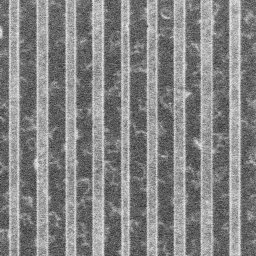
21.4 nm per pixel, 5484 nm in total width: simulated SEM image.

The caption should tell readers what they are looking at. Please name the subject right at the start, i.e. parallel lines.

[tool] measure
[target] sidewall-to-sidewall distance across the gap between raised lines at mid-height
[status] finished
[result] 185 nanometres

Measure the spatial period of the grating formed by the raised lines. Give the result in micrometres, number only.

0.588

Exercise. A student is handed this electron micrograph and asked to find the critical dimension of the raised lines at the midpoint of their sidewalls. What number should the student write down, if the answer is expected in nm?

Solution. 407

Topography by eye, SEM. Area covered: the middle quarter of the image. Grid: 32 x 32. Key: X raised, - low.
---XXXX---XXXX--XXXXX--XXXXX--XX
---XXXX---XXXX--XXXXX--XXXXX--XX
---XXXX---XXXX--XXXXX--XXXXX--XX
---XXXX---XXXX--XXXXX--XXXXX--XX
---XXXX---XXXX--XXXXX--XXXXX--XX
---XXXX---XXXX--XXXXX--XXXXX--XX
---XXXX---XXXX--XXXXX--XXXXX--XX
---XXXX---XXXX--XXXXX--XXXXX--X-
---XXXX---XXXX--XXXXX--XXXXX--XX
---XXXX---XXXX--XXXXX--XXXXX--XX
---XXXX---XXXX--XXXXX--XXXXX--XX
---XXXX---XXXX--XXXXX--XXXXX--XX
---XXXX---XXXX--XXXXX--XXXXX--XX
---XXXX---XXXX--XXXXX--XXXXX--XX
---XXXX---XXXX--XXXXX--XXXXX--XX
---XXXX---XXXX--XXXXX--XXXXX--XX
---XXXX---XXXX--XXXXX--XXXXX--XX
---XXXX---XXXX--XXXXX--XXXXX--XX
---XXXX---XXXX--XXXXX--XXXXX--XX
---XXXX---XXXX--XXXXX--XXXXX--XX
---XXXX---XXXX--XXXXX--XXXXX--XX
---XXXX---XXXX--XXXXX--XXXXX--XX
---XXXX---XXXX--XXXXX--XXXXX--XX
---XXXX---XXXX--XXXXX--XXXXX--XX
---XXXX---XXXX--XXXXX--XXXXX--XX
---XXXX---XXXX--XXXXX--XXXXX--XX
---XXXX---XXXX--XXXXX--XXXXX--XX
---XXXX---XXXX--XXXXX--XXXXX--XX
---XXXX---XXXX--XXXXX--XXXXX--XX
---X--X---XXXX--XXXXX--XXXXX--XX
---XXXX---XXXX--XXXXX--XXXXX--XX
---XXXX---XXXX--XXXXX--XXXXX--XX